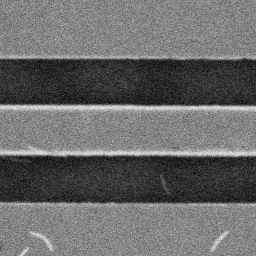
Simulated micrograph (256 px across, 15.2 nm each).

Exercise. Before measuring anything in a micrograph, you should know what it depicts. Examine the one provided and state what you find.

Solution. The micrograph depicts lines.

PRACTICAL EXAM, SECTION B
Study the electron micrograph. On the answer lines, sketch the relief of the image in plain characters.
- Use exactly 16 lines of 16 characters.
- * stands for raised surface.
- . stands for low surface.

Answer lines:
****************
****************
****************
****************
................
................
................
****************
****************
****************
................
................
................
****************
****************
****************